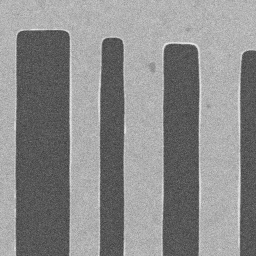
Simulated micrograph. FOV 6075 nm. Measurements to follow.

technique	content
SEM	groups of lines, slits or small figures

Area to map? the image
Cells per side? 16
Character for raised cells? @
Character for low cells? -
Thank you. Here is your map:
@@@@@@@@@@@@@@@@
@@@@@@@@@@@@@@@@
@---@@@@@@@@@@@@
@---@@--@@--@@@-
@---@@--@@---@@-
@---@@--@@---@@-
@---@@--@@---@@-
@---@@--@@---@@-
@---@@--@@--@@@-
@---@@--@@--@@@-
@---@@--@@---@@-
@---@@--@@---@@-
@---@@--@@---@@-
@---@@--@@--@@@-
@---@@--@@--@@@-
@---@@--@@--@@@-